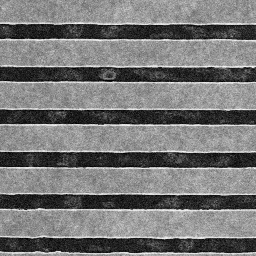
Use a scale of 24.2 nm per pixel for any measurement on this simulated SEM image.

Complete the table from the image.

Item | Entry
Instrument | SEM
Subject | parallel lines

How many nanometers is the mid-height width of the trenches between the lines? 375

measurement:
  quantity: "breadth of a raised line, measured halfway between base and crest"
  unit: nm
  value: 650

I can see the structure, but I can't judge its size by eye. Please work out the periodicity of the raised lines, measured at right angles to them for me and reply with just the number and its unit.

1.03 microns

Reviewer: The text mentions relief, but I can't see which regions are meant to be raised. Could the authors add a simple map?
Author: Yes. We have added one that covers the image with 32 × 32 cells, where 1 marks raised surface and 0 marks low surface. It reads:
11111111111111111111111111111111
11111111111111111111111111111111
11111111111111111111111111111111
00000000000000000000000000000000
00000000000000000000000000000000
11111111111111111111111111111111
11111111111111111111111111111111
11111111111111111111111111111111
00000000000000000000000000000000
00000000000000000000000000000000
11111111111111111111111111111111
11111111111111111111111111111111
11111111111111111111111111111111
11111111111111111111111111111111
00000000000000000000000000000000
00000000000000000000000000000000
11111111111111111111111111111111
11111111111111111111111111111111
11111111111111111111111111111111
00000000000000000000000000000000
00000000000000000000000000000000
11111111111111111111111111111111
11111111111111111111111111111111
11111111111111111111111111111111
00000000000000000000000000000000
00000000000000000000000000000000
11111111111111111111111111111111
11111111111111111111111111111111
11111111111111111111111111111111
11111111111111111111111111111111
00000000000000000000000000000000
00000001000000000000000000000000